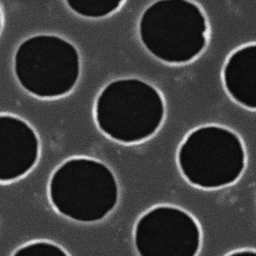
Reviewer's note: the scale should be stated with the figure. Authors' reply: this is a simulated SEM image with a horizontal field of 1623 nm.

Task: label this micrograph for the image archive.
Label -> holes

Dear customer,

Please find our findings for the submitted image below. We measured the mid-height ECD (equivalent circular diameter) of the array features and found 403 nm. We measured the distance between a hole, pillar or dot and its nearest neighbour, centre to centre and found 92.7 px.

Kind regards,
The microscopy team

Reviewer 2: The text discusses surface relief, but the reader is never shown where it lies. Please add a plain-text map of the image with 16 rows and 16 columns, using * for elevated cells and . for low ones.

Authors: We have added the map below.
*****..**...****
*********....***
**..*****....***
*....*****..***.
*....*********..
**..***..*****..
******....*****.
.*****....******
..*****..***...*
..*********....*
..**...****....*
***....*****..**
***....*********
****..***...****
*********...****
**..*****...****